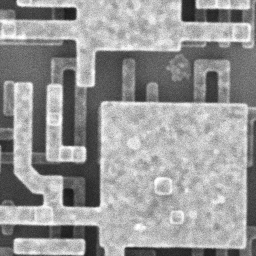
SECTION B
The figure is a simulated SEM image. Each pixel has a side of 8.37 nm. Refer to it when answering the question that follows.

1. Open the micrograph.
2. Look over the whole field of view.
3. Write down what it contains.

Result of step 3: wiring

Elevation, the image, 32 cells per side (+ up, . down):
..+++++++++++++++++++++..++++++.
..........+++++++++++++.........
.........++++++++++++++.........
+++++++++++++++++++++++++++++++.
+++++++++++++++++++++++++++++++.
..........+++++++++++++.........
..........++....................
..........++....................
..........++....................
..........++....................
..++......++....................
..++..++........................
..++..++........................
..++..++.....++++++++++++++++++.
..++..++.....++++++++++++++++++.
..++..++.....++++++++++++++++++.
..++..++.....++++++++++++++++++.
..++..++.....++++++++++++++++++.
..++..++++...++++++++++++++++++.
..++..+++++..++++++++++++++++++.
..++.........++++++++++++++++++.
..+++........++++++++++++++++++.
...+++++.....++++++++++++++++++.
...+++++.....++++++++++++++++++.
.....+++.....++++++++++++++++++.
.....+++....+++++++++++++++++++.
+++++++++++++++++++++++++++++++.
+++++++++++++++++++++++++++++++.
............+++++++++++++++++++.
............+++++++++++++++++++.
..+++++++++..++++++++++++++++++.
..+++++++++..++.................